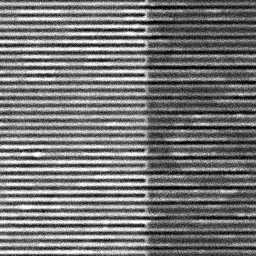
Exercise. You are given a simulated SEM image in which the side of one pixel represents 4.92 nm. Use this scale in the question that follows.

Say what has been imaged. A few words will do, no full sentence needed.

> parallel lines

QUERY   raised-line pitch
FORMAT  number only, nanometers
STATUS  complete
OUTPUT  37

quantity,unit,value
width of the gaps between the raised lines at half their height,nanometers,24.6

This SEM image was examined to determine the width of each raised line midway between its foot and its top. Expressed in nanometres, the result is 11.1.